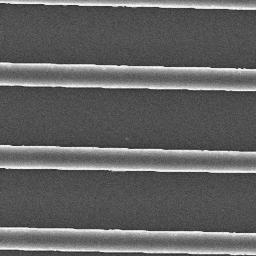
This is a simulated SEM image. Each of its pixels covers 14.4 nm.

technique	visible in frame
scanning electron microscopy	lines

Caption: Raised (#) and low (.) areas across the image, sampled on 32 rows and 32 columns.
.....###########################
................................
................................
................................
................................
................................
................................
................................
#########################.#.....
################################
################################
................................
................................
................................
................................
................................
................................
................................
############....................
################################
################################
...........................#####
................................
................................
................................
................................
................................
................................
................................
################################
################################
....................############